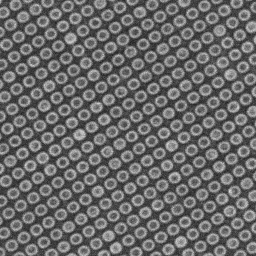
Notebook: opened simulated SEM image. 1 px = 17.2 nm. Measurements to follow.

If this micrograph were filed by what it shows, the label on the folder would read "a regular array of raised bodies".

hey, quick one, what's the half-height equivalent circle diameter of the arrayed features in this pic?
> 0.173 micrometres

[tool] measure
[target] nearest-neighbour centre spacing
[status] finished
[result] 246 nm